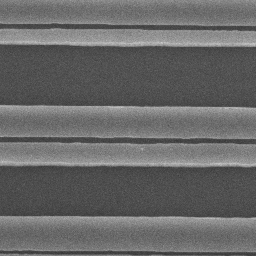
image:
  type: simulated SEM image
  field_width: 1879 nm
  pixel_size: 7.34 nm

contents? lines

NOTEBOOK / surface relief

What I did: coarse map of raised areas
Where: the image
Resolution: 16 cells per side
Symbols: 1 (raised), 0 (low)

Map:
1111111111111111
1111111111111111
1111111111111111
0000000000000000
0000000000000000
0000000000000000
0000000000000000
1111111111111111
1111111111111111
1111111111111111
0000000000000000
0000000000000000
0000000000000000
0000000000000000
1111111111111111
1111111111111111